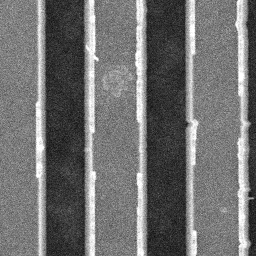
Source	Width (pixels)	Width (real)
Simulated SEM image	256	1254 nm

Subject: one or a few lines or trenches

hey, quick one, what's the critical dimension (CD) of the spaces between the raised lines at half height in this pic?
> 45.4 pixels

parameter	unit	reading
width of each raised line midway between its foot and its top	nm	276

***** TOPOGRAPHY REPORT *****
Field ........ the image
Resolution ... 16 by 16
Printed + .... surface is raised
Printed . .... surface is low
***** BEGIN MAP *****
+++...+++...+++.
+++...+++...+++.
+++..++++...+++.
+++..++++...+++.
+++...+++...+++.
+++..++++...+++.
+++..++++...+++.
+++...+++...+++.
+++...+++...+++.
+++..++++...+++.
+++...+++...+++.
+++...+++...+++.
+++...+++...+++.
+++...+++...+++.
+++...+++...+++.
+++..++++...+++.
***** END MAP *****